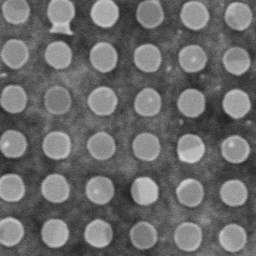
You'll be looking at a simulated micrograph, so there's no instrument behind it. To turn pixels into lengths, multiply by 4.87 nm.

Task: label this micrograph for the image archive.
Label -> a regular array of raised bodies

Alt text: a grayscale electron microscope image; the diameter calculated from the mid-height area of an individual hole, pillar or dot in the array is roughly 131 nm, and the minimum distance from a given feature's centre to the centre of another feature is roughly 0.213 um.